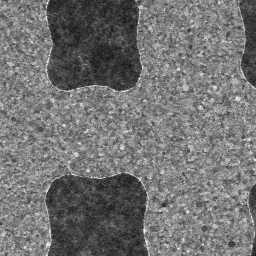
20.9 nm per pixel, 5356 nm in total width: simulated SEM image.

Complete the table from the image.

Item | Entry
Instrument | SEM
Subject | holes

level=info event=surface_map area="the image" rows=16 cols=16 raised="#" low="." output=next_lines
###......######.
###......######.
###......######.
###......######.
###......######.
####.##.########
################
################
################
################
################
###......#######
###......#######
###......#######
###......#######
###......#######